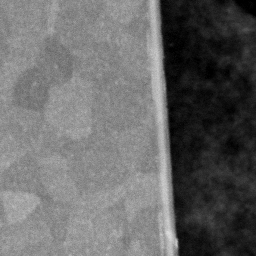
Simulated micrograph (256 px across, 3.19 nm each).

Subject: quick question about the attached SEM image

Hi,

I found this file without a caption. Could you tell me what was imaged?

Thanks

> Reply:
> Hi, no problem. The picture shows one or a few lines or trenches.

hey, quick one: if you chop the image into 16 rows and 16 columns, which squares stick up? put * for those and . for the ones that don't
**********......
**********......
**********......
**********......
**********......
**********......
**********......
**********......
**********......
**********......
**********......
**********......
**********......
**********......
***********.....
***********.....